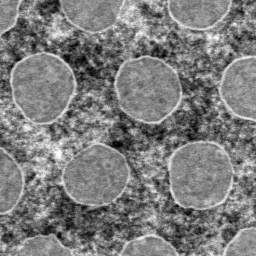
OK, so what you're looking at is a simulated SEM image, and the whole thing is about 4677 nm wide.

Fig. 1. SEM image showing raised bodies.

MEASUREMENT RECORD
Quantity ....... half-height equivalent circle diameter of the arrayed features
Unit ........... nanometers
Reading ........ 1200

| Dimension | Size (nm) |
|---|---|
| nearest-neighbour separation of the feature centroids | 1840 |